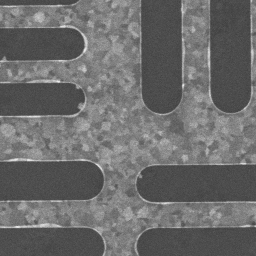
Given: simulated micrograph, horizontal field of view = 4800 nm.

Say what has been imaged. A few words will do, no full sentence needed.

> groups of lines, slits or small figures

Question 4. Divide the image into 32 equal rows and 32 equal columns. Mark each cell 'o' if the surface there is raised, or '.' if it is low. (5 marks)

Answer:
.........ooooooooo.....ooo.....o
oooooooooooooooooo.....ooo.....o
oooooooooooooooooo.....ooo.....o
.........ooooooooo.....ooo.....o
..........oooooooo.....ooo.....o
...........ooooooo.....ooo.....o
..........oooooooo.....ooo......
.........ooooooooo.....ooo......
oooooooooooooooooo.....ooo.....o
oooooooooooooooooo.....ooo.....o
.........ooooooooo.....ooo.....o
..........oooooooo.....ooo.....o
...........ooooooo.....ooo.....o
..........oooooooo....ooooo....o
.........ooooooooooooooooooooooo
oooooooooooooooooooooooooooooooo
oooooooooooooooooooooooooooooooo
oooooooooooooooooooooooooooooooo
oooooooooooooooooooooooooooooooo
oooooooooooooooooooooooooooooooo
............oooooooooooooooooo.o
.............ooooo..............
.............oooo...............
.............oooo...............
............oooooo..............
oooooooooooooooooooooooooooooooo
oooooooooooooooooooooooooooooooo
oooooooooooooooooooooooooooooooo
...........oooooooo.............
.............oooo...............
.............oooo...............
.............oooo...............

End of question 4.